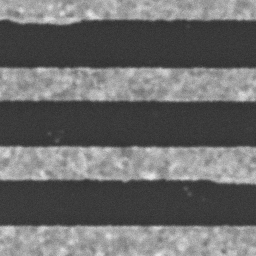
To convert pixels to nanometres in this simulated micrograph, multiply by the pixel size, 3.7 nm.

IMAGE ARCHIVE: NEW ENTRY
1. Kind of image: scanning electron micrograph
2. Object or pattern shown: lines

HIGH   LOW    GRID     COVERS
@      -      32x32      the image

@@@@@@@@@@@@@@@@@@@@@@@@@@@@@@@@
@@@@@@@@@@@@@@@@@@@@@@@@@@@@@@@@
--------------------------------
--------------------------------
--------------------------------
--------------------------------
--------------------------------
--------------------------------
--------------------------------
@@@@@@@@@@@@@@@@@@@@@@@@@@@@@@@@
@@@@@@@@@@@@@@@@@@@@@@@@@@@@@@@@
@@@@@@@@@@@@@@@@@@@@@@@@@@@@@@@@
@@@-@--@@--@@@@@@@@@@@@@@@@@@@@@
--------------------------------
--------------------------------
--------------------------------
--------------------------------
--------------------------------
@@@@@@@@@@-@@@--@@-@-----@---@@@
@@@@@@@@@@@@@@@@@@@@@@@@@@@@@@@@
@@@@@@@@@@@@@@@@@@@@@@@@@@@@@@@@
@@@@@@@@@@@@@@@@@@@@@@@@@@@@@@@@
---------------@----------------
--------------------------------
--------------------------------
--------------------------------
--------------------------------
--------------------------------
@@@@@@@@@@@@@@@@@@@@@@@@@@@@@@@@
@@@@@@@@@@@@@@@@@@@@@@@@@@@@@@@@
@@@@@@@@@@@@@@@@@@@@@@@@@@@@@@@@
@@@@@@@@@@@@@@@@@@@@@@@@@@@@@@@@